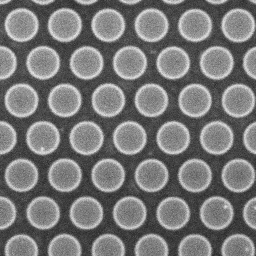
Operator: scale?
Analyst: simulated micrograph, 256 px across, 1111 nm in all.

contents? an array of small figures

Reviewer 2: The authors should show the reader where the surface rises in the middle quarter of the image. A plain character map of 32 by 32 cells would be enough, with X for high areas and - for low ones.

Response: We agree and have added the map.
--XXXXXXXX---XXXXXXX---XXXXXXXX-
--XXXXXXX----XXXXXXX----XXXXXXX-
---XXXXXX----XXXXXXX----XXXXXX--
-----XX--------XXX--------XX----
--------------------------------
XX-------XXXX-------XXXX-------X
XXX-----XXXXXX-----XXXXXX-----XX
XXXX---XXXXXXXX---XXXXXXXX---XXX
XXXX---XXXXXXXX---XXXXXXXX---XXX
XXXX---XXXXXXXX---XXXXXXXX---XXX
XXXX---XXXXXXXX---XXXXXXXX---XXX
XXX-----XXXXXX-----XXXXXX----XXX
XX-------XXXX-------XXXX-------X
--------------------------------
--------------------------------
---XXXXX------XXXXX------XXXXX--
--XXXXXXX----XXXXXXX----XXXXXXX-
--XXXXXXXX---XXXXXXX---XXXXXXXX-
--XXXXXXXX---XXXXXXX---XXXXXXXX-
--XXXXXXXX---XXXXXXX---XXXXXXXX-
--XXXXXXX----XXXXXXX----XXXXXXX-
---XXXXX------XXXXX-----XXXXXX--
-----XX-------------------------
--------------------------------
XX-------XXXX-------XXXX-------X
XXXX----XXXXXX-----XXXXXX-----XX
XXXX---XXXXXXXX---XXXXXXXX---XXX
XXXX---XXXXXXXX---XXXXXXXX---XXX
XXXX---XXXXXXXX---XXXXXXXX---XXX
XXXX---XXXXXXXX---XXXXXXX----XXX
XXX-----XXXXXX-----XXXXXX-----XX
XX-------XXXX-------XXXX-------X